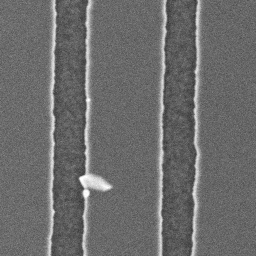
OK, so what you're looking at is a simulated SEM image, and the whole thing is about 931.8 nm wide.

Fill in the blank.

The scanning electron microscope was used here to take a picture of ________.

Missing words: lines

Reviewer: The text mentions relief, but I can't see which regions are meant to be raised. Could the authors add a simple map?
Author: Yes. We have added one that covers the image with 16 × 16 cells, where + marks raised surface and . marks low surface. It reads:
+++..+++++..++++
+++..+++++..++++
+++..+++++..++++
+++..+++++..++++
+++..+++++..++++
+++..+++++..++++
+++..+++++..++++
+++..+++++..++++
+++..+++++..++++
+++..+++++..++++
+++..+++++..++++
+++..+++++..++++
+++..+++++..++++
+++..+++++..++++
+++..+++++..++++
+++..+++++..++++